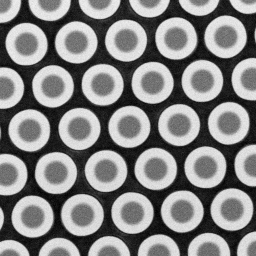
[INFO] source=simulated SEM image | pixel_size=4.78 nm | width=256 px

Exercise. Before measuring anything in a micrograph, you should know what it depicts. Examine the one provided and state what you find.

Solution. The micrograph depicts an array of small figures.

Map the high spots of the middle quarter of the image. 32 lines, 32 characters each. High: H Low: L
LLLLLLLLHHHHLLLLLLLHHHHHHLLLLLLH
LLLLLLHHHHHHHLLLLLHHHHHHHHLLLLHH
HLLLLHHHHHHHHHLLLHHHHHHHHHHLLLHH
HHLLLHHHHHHHHHHLLHHHHHHHHHHLLLHH
HHLLLHHHHHHHHHHLLHHHHHHHHHHLLLHH
HHLLLHHHHHHHHHHLLHHHHHHHHHHLLLHH
HHLLLHHHHHHHHHHLLHHHHHHHHHHLLLHH
HHLLLHHHHHHHHHLLLLHHHHHHHHHLLLHH
HLLLLLHHHHHHHHLLLLHHHHHHHHLLLLLH
HLLLLLLHHHHHHLLLLLLLHHHHLLLLLLLL
LLLLLLLLLLLLLLLLLLLLLLLLLLLHHHHL
LLHHHHLLLLLLLHHHHHHLLLLLLHHHHHHH
HHHHHHHLLLLLHHHHHHHHLLLLHHHHHHHH
HHHHHHHHLLLLHHHHHHHHHLLLHHHHHHHH
HHHHHHHHHLLHHHHHHHHHHLLLHHHHHHHH
HHHHHHHHHLLHHHHHHHHHHLLLHHHHHHHH
HHHHHHHHHLLHHHHHHHHHHLLLHHHHHHHH
HHHHHHHHHLLHHHHHHHHHHLLLHHHHHHHH
HHHHHHHHLLLLHHHHHHHHHLLLLHHHHHHH
HHHHHHHHLLLLLHHHHHHHLLLLLLHHHHHH
LHHHHHHLLLLLLLHHHHLLLLLLLLLLLLLL
LLLLLLLLLLLLLLLLLLLLLHHHHLLLLLLL
LLLLLLLLHHHHHLLLLLLHHHHHHHHLLLLH
HHLLLLHHHHHHHHHLLLLHHHHHHHHLLLLH
HHLLLLHHHHHHHHHLLLHHHHHHHHHHLLHH
HHHLLHHHHHHHHHHHLLHHHHHHHHHHLLHH
HHHLLHHHHHHHHHHHLLHHHHHHHHHHLLHH
HHHLLHHHHHHHHHHHLLHHHHHHHHHHLLHH
HHHLLLHHHHHHHHHLLLHHHHHHHHHHLLLH
HHHLLLHHHHHHHHHLLLLHHHHHHHHLLLLL
HHLLLLLHHHHHHHLLLLLLHHHHHHLLLLLL
HLLLLLLLHHHHHLLLLLLLLLLLLLLLLLLL